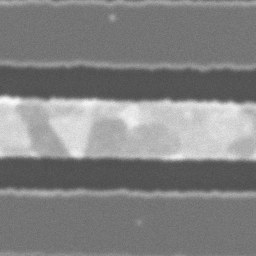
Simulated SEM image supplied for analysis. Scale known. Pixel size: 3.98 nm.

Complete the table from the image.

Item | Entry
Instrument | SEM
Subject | lines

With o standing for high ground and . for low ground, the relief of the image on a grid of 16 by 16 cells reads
oooooooooooooooo
oooooooooooooooo
oooooooooooooooo
oooooooooooooooo
................
................
oooooooooooooooo
oooooooooooooooo
oooooooooooooooo
oooooooooooooooo
................
................
oooooooooooooooo
oooooooooooooooo
oooooooooooooooo
oooooooooooooooo